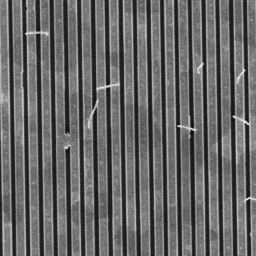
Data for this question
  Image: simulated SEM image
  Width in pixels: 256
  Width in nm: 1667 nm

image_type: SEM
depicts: parallel lines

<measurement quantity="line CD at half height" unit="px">8.88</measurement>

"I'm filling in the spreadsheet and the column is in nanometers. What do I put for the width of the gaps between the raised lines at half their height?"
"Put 34.2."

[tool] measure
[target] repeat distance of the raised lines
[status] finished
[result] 89.9 nm